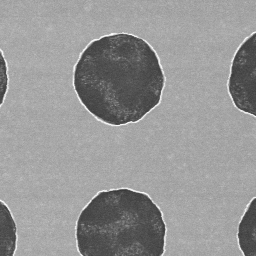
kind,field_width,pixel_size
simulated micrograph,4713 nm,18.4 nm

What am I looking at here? holes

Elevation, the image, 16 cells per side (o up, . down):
oooooooooooooooo
oooooooooooooooo
oooooo...oooooo.
ooooo.....ooooo.
ooooo.....oooo..
ooooo.....oooo..
ooooo.....ooooo.
oooooo...ooooooo
oooooooooooooooo
oooooooooooooooo
oooooooooooooooo
oooooooooooooooo
oooooo...ooooooo
.oooo.....ooooo.
.oooo.....ooooo.
.oooo.....ooooo.